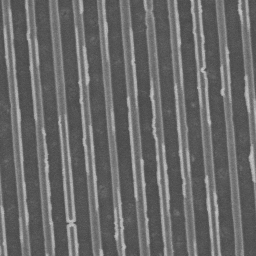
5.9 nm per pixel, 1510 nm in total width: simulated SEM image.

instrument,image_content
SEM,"parallel lines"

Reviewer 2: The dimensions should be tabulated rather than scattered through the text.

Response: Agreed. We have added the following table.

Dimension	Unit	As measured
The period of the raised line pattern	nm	140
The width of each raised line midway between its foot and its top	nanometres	52.2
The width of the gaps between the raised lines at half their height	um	0.0875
